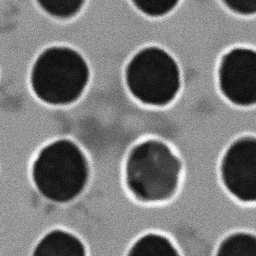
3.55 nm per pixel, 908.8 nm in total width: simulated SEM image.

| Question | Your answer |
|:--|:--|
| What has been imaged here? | holes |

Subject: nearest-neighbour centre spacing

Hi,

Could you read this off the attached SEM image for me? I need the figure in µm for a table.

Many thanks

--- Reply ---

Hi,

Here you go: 0.33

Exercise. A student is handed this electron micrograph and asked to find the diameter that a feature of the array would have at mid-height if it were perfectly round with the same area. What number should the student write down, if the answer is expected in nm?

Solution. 205